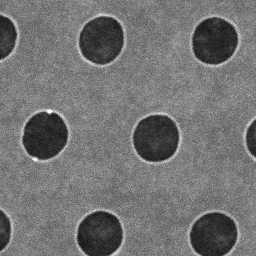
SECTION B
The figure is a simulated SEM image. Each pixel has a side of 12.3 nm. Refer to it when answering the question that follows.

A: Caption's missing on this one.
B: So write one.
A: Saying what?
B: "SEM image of holes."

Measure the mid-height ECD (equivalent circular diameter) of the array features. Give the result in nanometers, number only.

583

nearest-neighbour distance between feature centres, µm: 1.37